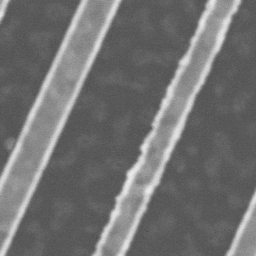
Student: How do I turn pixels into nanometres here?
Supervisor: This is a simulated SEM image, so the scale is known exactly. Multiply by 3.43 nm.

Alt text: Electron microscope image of one or a few lines or trenches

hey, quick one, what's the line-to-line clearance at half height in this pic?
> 84.3 px